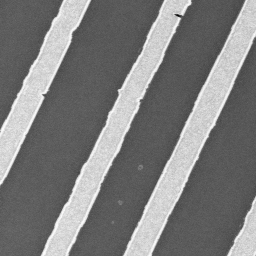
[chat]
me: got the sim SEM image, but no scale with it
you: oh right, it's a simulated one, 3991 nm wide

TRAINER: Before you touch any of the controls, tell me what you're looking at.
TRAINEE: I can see one or a few lines or trenches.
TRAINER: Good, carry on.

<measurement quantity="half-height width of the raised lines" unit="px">21.3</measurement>